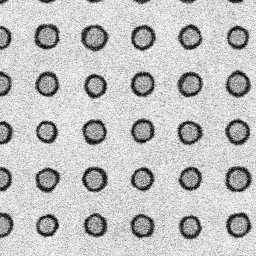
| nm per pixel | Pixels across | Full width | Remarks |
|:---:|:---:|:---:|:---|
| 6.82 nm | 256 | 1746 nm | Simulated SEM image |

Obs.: a regular array of ring-shaped grooves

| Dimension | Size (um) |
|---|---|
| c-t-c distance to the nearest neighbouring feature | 0.317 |